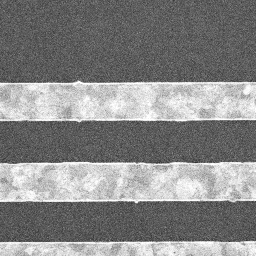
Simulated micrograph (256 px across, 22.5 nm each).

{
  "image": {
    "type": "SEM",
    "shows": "one or a few lines or trenches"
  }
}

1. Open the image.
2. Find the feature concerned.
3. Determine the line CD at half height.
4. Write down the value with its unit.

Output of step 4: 828 nanometers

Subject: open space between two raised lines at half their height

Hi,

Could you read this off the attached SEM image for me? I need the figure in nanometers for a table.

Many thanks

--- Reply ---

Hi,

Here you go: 961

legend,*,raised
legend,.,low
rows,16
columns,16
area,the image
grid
................
................
................
................
................
****************
****************
....**..........
................
................
****************
****************
*********.....*.
................
................
****************